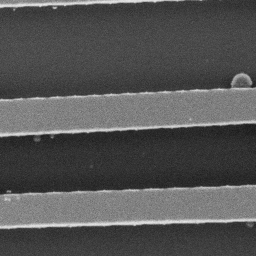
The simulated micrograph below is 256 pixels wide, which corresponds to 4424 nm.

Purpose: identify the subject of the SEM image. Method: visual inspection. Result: lines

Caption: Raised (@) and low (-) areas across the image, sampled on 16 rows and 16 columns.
----------------
----------------
----------------
----------------
----------------
----------------
@@@@@@@@@@@@@@@@
@@@@@@@@@@@@@@@@
@---------------
----------------
----------------
----------------
@@@@@@@@@@@@@@@@
@@@@@@@@@@@@@@@@
----------------
----------------